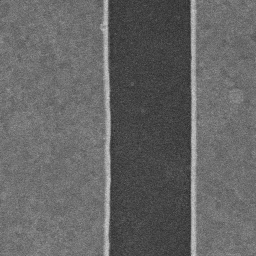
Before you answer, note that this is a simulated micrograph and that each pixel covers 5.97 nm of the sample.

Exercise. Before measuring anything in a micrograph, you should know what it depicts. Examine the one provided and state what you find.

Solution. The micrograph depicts one or a few lines or trenches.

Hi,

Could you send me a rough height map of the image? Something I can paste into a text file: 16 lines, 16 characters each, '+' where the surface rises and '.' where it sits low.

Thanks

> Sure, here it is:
+++++++.....++++
+++++++.....++++
+++++++.....++++
+++++++.....++++
+++++++.....++++
+++++++.....++++
+++++++.....++++
+++++++.....++++
+++++++.....++++
+++++++.....++++
+++++++.....++++
+++++++.....++++
+++++++.....++++
+++++++.....++++
+++++++.....++++
+++++++.....++++